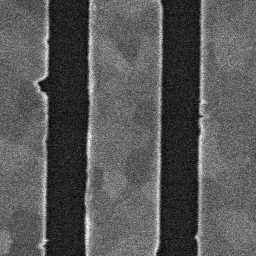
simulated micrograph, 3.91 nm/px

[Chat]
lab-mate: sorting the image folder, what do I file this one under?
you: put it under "one or a few lines or trenches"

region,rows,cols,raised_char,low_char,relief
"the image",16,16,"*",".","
***...****...***
***...****...***
***...****...***
***...****...***
***...****...***
***...****...***
***...****...***
***...****...***
***...****...***
***...****...***
***...****...***
***..*****..****
***..*****..****
***..*****..****
***..*****..****
***..*****..****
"